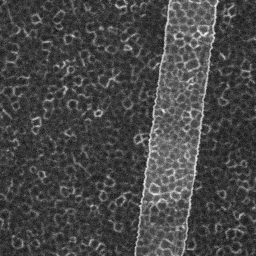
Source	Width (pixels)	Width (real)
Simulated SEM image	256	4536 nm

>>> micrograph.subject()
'one or a few lines or trenches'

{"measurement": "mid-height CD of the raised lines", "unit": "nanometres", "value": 816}